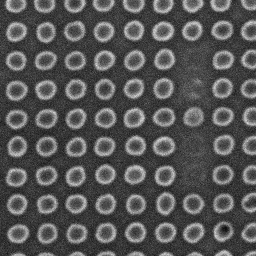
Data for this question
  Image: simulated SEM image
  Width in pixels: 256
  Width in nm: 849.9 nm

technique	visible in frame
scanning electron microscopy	a regular array of raised bodies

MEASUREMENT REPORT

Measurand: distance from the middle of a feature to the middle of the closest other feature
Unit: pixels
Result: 28.3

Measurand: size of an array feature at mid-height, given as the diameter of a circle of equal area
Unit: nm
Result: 62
